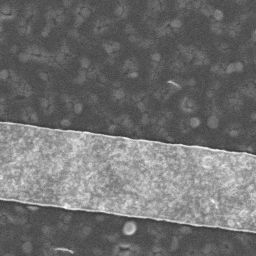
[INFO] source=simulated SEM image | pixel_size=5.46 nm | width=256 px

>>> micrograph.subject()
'one or a few lines or trenches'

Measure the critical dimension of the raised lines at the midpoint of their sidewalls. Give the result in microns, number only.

0.416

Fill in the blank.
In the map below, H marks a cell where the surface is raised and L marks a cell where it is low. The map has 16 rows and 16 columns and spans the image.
LLLLLLLLLLLLLLLL
LLLLLLLLLLLLLLLL
LLLLLLLLLLLLLLLL
LLLLLLLLLLLLLLLL
LLLLLLLLLLLLLLLL
LLLLLLLLLLLLLLLL
LLLLLLLLLLLLLLLL
LLLLLLLLLLLLLLLL
HHHHHHHLLLLLLLLL
HHHHHHHHHHHHHHLL
HHHHHHHHHHHHHHHH
HHHHHHHHHHHHHHHH
LHHHHHHHHHHHHHHH
LLLLLLLLHHHHHHHH
LLLLLLLLLLLLLLLL
LLLLLLLLLLLLLLLL